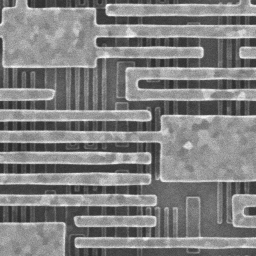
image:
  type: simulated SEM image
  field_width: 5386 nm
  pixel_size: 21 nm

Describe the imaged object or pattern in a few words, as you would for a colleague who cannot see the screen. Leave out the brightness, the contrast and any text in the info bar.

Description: wiring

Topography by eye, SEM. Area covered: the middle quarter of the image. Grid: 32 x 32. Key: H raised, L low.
HHHHHHHHLLLLLLLLLLLLLLLLLLLLLLLL
LLLLLLLLLLLLLLLLHHHHHHHHHHHHHHHH
LLLLLLLLLLLLLLLLHHHHHHHHHHHHHHHH
LLLLLLLLLLLLLLLLHHHHHHHHHHHHHHHH
LLLLLLLLLLLLLLLLHHLLLLLLLLLLLLLL
LLLLLLLLLLLLLLLLHHLLLLLLLLLLLLLL
LLLLLLLLLLLLLLLLHHHHHHHHHHHHHHHH
LLLLLLLLLLLLLLLLHHHHHHHHHHHHHHHH
LLLLLLLLLLLLLLLLHHHHHHHHHHHHHHHH
LLLLLLLLLLLLLLLLLLLLLLLLLLLLLLLL
LLLLLLLLLLLLLLLLLLLLLLLLLLLLLLLL
LLLLLLLLLLLLLLLLLLLLLLLLLLLLLLLL
HHHHHHHHHHHHHHHHHHHHHHLLLLLLLLLL
HHHHHHHHHHHHHHHHHHHHHHLLHHHHHHHH
LLLLLLLLLLLLLLLLLLLLLLLLHHHHHHHH
LLLLLLLLLLLLLLLLLLLLLLLLHHHHHHHH
LLLLLLLLLLLLLLLLLLLLLLLLHHHHHHHH
HHHHHHHHHHHHHHHHHHHHHHHHHHHHHHHH
HHHHHHHHHHHHHHHHHHHHHHHHHHHHHHHH
LLLLLLLLLLLLLLLLLLLLLLLLHHHHHHHH
LLLLLLLLLLLLLLLLLLLLLLLLHHHHHHHH
LLLLLLLLLLLLLLLLLLLLLLLLHHHHHHHH
HHHHHHHHHHHHHHHHHHHHHHLLHHHHHHHH
HHHHHHHHHHHHHHHHHHHHHHLLHHHHHHHH
HHHHHHHHHHHHHHHHHHHHHHLLHHHHHHHH
LLLLLLLLLLLLLLLLLLLLLLLLHHHHHHHH
LLLLLLLLLLLLLLLLLLLLLLLLHHHHHHHH
HHHHHHHHHHHHHHHHHHHHHLLLHHHHHHHH
HHHHHHHHHHHHHHHHHHHHHHLLHHHHHHHH
HHHHHHHHHHHHHHHHHHHHHHLLLLLLLLLL
LLLLLLLLLLLLLLLLLLLLLLLLLLLLLLLL
LLLLLLLLLLLLLLLLLLLLLLLLLLLLLLLL